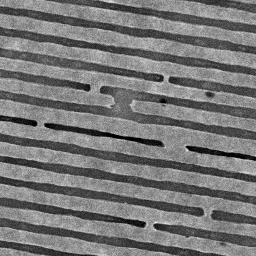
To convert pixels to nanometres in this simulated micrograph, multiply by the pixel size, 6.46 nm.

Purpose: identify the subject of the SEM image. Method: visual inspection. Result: parallel lines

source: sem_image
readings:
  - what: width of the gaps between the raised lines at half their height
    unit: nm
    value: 55.8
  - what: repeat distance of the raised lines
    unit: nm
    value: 136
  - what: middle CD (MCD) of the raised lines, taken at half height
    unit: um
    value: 0.0836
